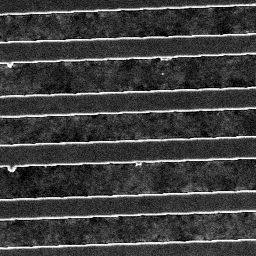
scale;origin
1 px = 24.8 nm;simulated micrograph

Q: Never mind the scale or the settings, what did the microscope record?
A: lines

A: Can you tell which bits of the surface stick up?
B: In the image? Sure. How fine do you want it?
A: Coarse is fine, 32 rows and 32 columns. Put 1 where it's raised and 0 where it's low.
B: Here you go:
11111111111111111111111111111111
11111111110000000000000000000000
00000000000000000000000000000000
00000000000000000000000000000000
00000000000000000000000011111111
11111111111111111111111111111111
11111111111111111111111111111111
11111111111000000000000000000000
00000000000000000000000000000000
00000000000000000000000000000000
00000000000000000000000000000000
00000000000000011111111111111111
11111111111111111111111111111111
11111111111111111111111111111111
11100000000000000000000000000000
00000000000000000000000000000000
00000000000000000000000000000000
00000000000000000000111111111111
11111111111111111111111111111111
11111111111111111111111111111111
11111111111000000000000000000000
00000000000000000000000000000000
00000000000000000000000000000000
00000000000000000000000000000000
00000000000000111111111111111111
11111111111111111111111111111111
11111111111111111111111111100000
00000000000000000000000000000000
00000000000000000000000000000000
00000000000000000000000000000000
00000000000000000111111111111111
11111111111111111111111111111111